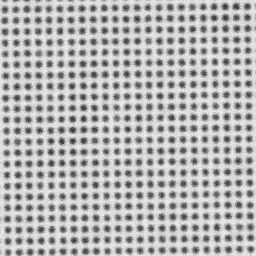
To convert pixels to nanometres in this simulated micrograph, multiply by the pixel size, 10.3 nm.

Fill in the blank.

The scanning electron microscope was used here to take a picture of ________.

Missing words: a regular array of holes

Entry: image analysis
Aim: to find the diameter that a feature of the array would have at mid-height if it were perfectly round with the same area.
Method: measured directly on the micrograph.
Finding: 86.4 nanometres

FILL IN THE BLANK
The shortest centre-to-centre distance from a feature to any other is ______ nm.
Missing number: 111